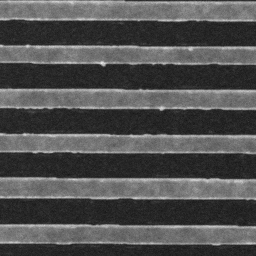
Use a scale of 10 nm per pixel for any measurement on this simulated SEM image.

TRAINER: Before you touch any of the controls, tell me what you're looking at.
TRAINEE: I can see lines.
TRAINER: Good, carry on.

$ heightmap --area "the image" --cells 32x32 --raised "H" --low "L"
HHHHHHHHHHHHHHHHHHHHHHHHHHHHHHHH
HHHHHHHHHHHHHHHHHHHHHHHHHHHHHHHH
LLLLLLLLLLLLLLLLLLLLHHHHLLHHHHHH
LLLLLLLLLLLLLLLLLLLLLLLLLLLLLLLL
LLLLLLLLLLLLLLLLLLLLLLLLLLLLLLLL
LLLLLLLLLLLLLLLLLLLLLLLLLLLLLLLL
HHHHHHHHHHHHHHHHHHHHHHHHHHHHHHHH
HHHHHHHHHHHHHHHHHHHHHHHHHHHHHHHH
LLLLLLLLLLLLLLLLLLLLLLLLLLLLLLLL
LLLLLLLLLLLLLLLLLLLLLLLLLLLLLLLL
LLLLLLLLLLLLLLLLLLLLLLLLLLLLLLLL
HHHHHHHHHHHHHHHHHHHHHHHHHHHHHHHH
HHHHHHHHHHHHHHHHHHHHHHHHHHHHHHHH
LLLLHHLLLLHHHHHHHHHHHHHHHHHHHHHH
LLLLLLLLLLLLLLLLLLLLLLLLLLLLLLLL
LLLLLLLLLLLLLLLLLLLLLLLLLLLLLLLL
LLLLLLLLLLLLLLLLLLLLLLLLLLLLLLLL
HHHHHHHHHHHHHHHHHHHHHHHHHHHHHHHH
HHHHHHHHHHHHHHHHHHHHHHHHHHHHHHHH
LLLLLLLLLLLLLLLLLLLLLLLLLLLLLLLL
LLLLLLLLLLLLLLLLLLLLLLLLLLLLLLLL
LLLLLLLLLLLLLLLLLLLLLLLLLLLLLLLL
HHHHHHHHHHHHHHHHHHHHHHHHHHHHHHHH
HHHHHHHHHHHHHHHHHHHHHHHHHHHHHHHH
HHHHHHHHHHHHHHHHHHHHHHHHHHHHHHHH
LLLLLLLLLLLLLLLLLLLLLLLLLLLLLLLL
LLLLLLLLLLLLLLLLLLLLLLLLLLLLLLLL
LLLLLLLLLLLLLLLLLLLLLLLLLLLLLLLL
HHHHHHHHHHHHHHHHHHHHHHHHHHHHHHHH
HHHHHHHHHHHHHHHHHHHHHHHHHHHHHHHH
LLLLLLLLLLLLLLLLLLLLLLLLLLHHLLLL
LLLLLLLLLLLLLLLLLLLLLLLLLLLLLLLL